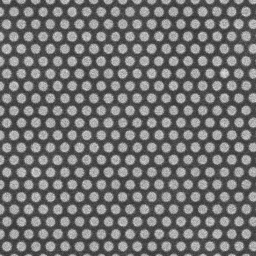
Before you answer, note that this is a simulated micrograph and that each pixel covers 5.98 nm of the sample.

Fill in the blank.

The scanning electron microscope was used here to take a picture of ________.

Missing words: a regular array of raised bodies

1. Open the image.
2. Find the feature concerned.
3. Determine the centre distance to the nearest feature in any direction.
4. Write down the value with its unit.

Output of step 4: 84.4 nm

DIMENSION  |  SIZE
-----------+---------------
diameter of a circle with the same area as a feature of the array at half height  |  0.0548 micrometres